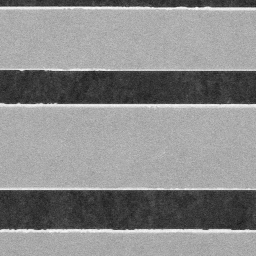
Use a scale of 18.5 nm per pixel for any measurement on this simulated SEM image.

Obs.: lines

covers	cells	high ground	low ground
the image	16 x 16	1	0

1011110000000000
1111111111111111
1111111111111111
1111111111111111
0000000000000000
0000000000000000
0000000000000000
1111111111111111
1111111111111111
1111111111111111
1111111111111111
1111111111111111
0000000000000000
0000000000000000
1111111111111111
1111111111111111